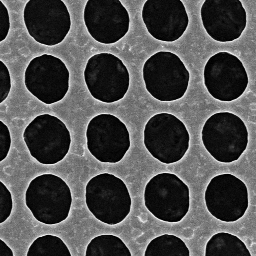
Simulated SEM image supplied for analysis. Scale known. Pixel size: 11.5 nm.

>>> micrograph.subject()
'a regular array of holes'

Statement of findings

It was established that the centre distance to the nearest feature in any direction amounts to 681 nanometres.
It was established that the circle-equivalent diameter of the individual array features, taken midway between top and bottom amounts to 0.546 um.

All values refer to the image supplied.